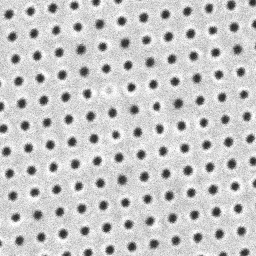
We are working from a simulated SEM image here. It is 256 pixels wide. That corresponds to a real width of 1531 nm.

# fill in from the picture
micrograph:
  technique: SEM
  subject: a regular array of holes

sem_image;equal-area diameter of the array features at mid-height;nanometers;60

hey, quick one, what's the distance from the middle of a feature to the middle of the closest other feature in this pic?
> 132 nanometres